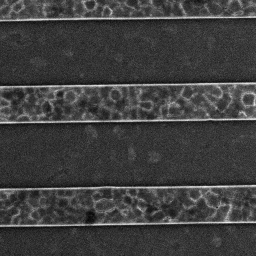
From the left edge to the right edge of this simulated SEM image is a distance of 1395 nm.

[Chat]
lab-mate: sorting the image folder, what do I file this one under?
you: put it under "one or a few lines or trenches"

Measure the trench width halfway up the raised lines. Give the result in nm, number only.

360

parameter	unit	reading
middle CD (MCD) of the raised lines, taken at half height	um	0.202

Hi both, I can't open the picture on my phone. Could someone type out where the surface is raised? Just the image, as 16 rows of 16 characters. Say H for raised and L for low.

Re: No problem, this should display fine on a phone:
HHHHHHHHHHHHHHHH
LLLLLLLLLLLLLLLL
LLLLLLLLLLLLLLLL
LLLLLLLLLLLLLLLL
LLLLLLLLLLLLLLLL
HHHHHHHHHHHHHHHH
HHHHHHHHHHHHHHHH
HHHHHHHHHHHHHLLL
LLLLLLLLLLLLLLLL
LLLLLLLLLLLLLLLL
LLLLLLLLLLLLLLLL
LLLLLLLLLLLLLLLL
HHHHHHHHHHHHHHHH
HHHHHHHHHHHHHHHH
LLLLLLLLLLLLLLLL
LLLLLLLLLLLLLLLL